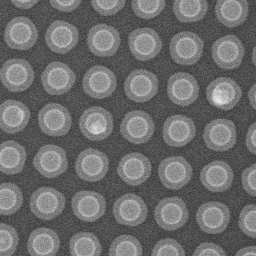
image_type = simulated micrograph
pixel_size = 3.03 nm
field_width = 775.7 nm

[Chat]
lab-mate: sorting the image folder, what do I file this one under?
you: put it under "an array of small figures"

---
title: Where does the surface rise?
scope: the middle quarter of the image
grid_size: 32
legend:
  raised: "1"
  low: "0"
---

10000000100000000000000000000000
11000011111000000011000000000000
11100111111100001111110000001110
11100111111110001111111000111111
11100111111110011111111000111111
11000111111110011111111000111111
10000111111110011111111000111111
00000011111100011111111000111111
00000000110000001111110000111111
00000000000000000010000000011111
00000000000000000000000000000000
10000011110000000000000000000000
10000111111100001111100000000000
11001111111100011111110000111110
11001111111100111111110001111111
11001111111100111111111001111111
10001111111100111111110001111111
00000111111100111111110001111111
00000011110000011111110001111111
00000000000000000111000001111110
00000000000000000000000000011100
00000111000000000000000000000000
00001111110000001110000000000000
10011111111000011111100000111100
10011111111000111111100011111110
10011111111001111111110011111111
10011111111001111111110011111111
00011111110000111111110011111111
00001111110000111111100011111111
00000000000000011111000011111110
00000000000000000000000001111100
00000000000000000000000000000000